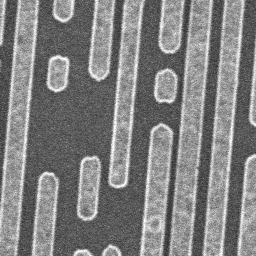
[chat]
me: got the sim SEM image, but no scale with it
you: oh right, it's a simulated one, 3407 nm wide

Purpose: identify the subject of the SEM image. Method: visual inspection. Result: parallel lines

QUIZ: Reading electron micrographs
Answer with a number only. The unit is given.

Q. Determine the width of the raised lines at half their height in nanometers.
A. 239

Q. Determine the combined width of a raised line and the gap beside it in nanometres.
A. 455